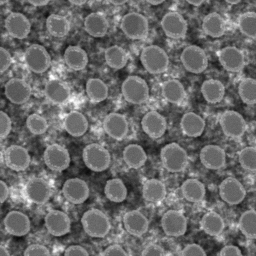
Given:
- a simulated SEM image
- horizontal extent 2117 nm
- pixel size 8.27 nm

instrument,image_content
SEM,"a regular array of raised bodies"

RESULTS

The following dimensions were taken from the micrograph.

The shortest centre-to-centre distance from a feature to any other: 0.31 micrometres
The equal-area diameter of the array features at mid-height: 194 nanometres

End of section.